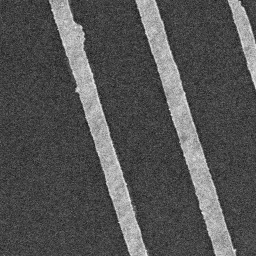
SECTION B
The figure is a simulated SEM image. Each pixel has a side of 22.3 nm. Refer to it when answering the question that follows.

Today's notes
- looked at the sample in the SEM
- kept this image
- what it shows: one or a few lines or trenches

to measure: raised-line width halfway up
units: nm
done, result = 377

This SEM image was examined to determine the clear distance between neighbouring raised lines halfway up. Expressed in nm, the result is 1460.